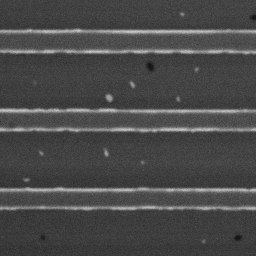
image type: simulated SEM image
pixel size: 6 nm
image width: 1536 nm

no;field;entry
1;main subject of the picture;lines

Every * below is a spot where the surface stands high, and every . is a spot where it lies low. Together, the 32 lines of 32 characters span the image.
................................
................................
................................
................................
********************************
********************************
.******..***********************
................................
................................
................................
................................
................................
................................
................................
********************************
********************************
................................
................................
................................
................................
................................
................................
................................
................................
********************************
********************************
................................
................................
................................
................................
................................
................................